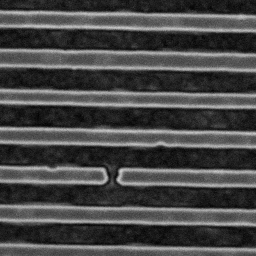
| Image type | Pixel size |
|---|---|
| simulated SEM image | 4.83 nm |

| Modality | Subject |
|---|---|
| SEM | parallel lines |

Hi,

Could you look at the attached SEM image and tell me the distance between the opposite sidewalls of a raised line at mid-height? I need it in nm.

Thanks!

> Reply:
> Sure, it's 76.6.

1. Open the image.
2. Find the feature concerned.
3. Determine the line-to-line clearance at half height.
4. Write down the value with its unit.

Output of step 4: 112 nm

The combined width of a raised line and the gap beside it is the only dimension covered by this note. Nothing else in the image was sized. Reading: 187 nanometers